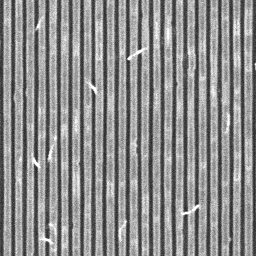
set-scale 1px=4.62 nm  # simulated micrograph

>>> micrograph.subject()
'parallel lines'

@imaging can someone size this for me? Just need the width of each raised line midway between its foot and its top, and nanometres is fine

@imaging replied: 32.3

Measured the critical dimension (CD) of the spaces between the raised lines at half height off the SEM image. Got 18.5 nanometres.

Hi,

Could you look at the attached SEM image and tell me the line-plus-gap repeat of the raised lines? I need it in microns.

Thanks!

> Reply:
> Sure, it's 0.053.